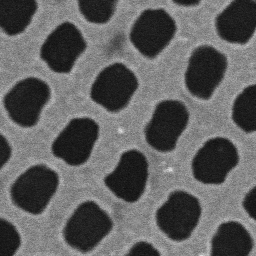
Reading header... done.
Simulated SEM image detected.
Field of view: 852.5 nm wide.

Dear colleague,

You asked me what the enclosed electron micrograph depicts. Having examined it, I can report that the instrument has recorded a regular array of holes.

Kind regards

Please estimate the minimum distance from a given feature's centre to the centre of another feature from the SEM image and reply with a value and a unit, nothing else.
63.5 px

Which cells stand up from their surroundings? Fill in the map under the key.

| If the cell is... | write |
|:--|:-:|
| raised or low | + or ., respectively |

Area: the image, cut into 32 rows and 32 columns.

.....+++++....++++++++..+++++...
....++++++....++++...+++++++....
....+++++++...+++.....+++++.....
...++++...+++++++.....+++++.....
++++++....++++++......+++++.....
+++++......++++++....+++++++++++
+++++.....+++++++...++++...+++++
+++++.....++++++++++++++....++++
++++++...++++...+++++++.....++++
++++++++++++.....++++++.....++++
++....++++++.....++++++....+++++
+.....+++++......+++++++...+++..
+.....++++++....+++++.+++++++...
+....++++++++..++++....++++++...
+....++++++++++++++.....+++++...
++..+++++...+++++++....++++++...
++++++++....++++++.....+++++++++
.++++++.....++++++....++++...+++
.+++++......+++++++...+++....+++
.++++++....++++...++++++......++
.+++++++..+++++...++++++......++
+++....+++++++.....+++++.....+++
++.....++++++.....+++++++...++++
+......+++++++....++++++++++++++
+.....+++++++++...+++...+++++++.
++....++++..++++++++.....+++++..
+++..++++....+++++++.....++++++.
.++++++++.....++++++.....+++++++
..++++++......++++++....+++....+
..++++++.....++++++++...+++....+
..++++++....+++++..+++++++......
..++++++++.+++++....++++++.....+